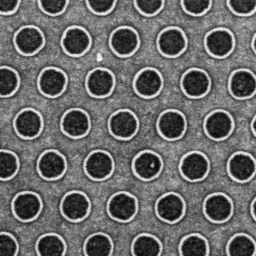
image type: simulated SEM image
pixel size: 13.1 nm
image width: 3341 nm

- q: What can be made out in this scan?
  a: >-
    a regular array of raised bodies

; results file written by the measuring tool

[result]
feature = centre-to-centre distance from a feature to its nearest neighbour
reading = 617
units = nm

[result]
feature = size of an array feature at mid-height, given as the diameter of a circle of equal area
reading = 384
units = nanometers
